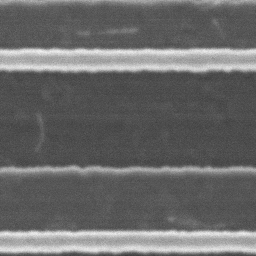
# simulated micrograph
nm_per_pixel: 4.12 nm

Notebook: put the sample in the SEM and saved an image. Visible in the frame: lines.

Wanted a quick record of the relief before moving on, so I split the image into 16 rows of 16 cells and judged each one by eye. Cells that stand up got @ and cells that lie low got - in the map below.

@@@@@@@@@@@@@@@@
@@@@@@@@@@@@@@@@
@@@@@@@@@@@@@@@@
@@@@@@@@@@@@@@@@
----------------
----------------
----------------
----------------
----------------
----------------
----------------
@@@@@@@@@@@@@@@@
@@@@@@@@@@@@@@@@
@@@@@@@@@@@@@@@@
@@@@@@@@@@@@@@@@
@@@@@@@@@@@@@@@@